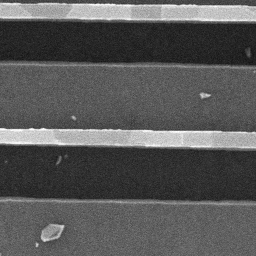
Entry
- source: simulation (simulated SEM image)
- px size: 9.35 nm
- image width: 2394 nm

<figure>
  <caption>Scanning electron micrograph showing lines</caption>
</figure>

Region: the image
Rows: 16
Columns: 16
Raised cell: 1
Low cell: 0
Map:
1111111111111111
0000000000000000
0000000000000000
0000000000000000
1111111111111111
1111111111111111
1111111111111111
1111111111111111
1111111111111111
0000000000000000
0000000000000000
0000000000000000
1100000000000000
1111111111111111
1111111111111111
1111111111111111